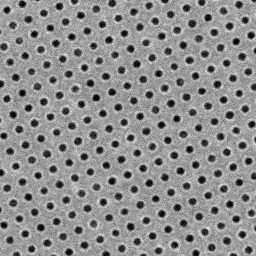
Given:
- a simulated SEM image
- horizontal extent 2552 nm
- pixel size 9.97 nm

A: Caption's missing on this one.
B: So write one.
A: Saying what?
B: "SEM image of a regular array of holes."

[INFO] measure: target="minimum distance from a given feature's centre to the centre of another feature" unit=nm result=163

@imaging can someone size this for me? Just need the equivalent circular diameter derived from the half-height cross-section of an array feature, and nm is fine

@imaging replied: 88.6